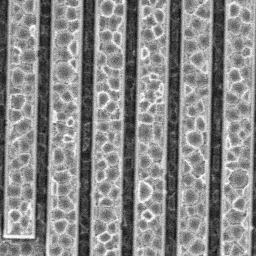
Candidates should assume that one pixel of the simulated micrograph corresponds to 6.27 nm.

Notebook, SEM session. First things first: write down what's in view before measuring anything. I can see parallel lines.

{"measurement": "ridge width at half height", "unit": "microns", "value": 0.183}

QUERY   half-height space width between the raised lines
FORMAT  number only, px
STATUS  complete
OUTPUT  13.7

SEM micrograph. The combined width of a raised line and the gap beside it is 272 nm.